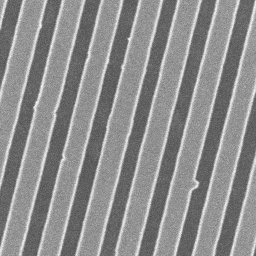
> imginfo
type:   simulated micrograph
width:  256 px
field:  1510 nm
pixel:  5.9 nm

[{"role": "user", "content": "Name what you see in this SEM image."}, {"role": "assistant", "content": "parallel lines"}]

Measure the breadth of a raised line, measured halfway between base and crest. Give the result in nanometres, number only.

126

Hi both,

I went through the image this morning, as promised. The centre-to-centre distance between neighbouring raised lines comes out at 0.221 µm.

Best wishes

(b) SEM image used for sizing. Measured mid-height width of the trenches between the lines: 0.093 um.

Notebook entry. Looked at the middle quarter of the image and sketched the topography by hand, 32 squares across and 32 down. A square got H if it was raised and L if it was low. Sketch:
HLLLLHHHHHHLLLLHHHHHHLLLHHHHHHLL
HLLLLHHHHHLLLLLHHHHHLLLLHHHHHHLL
HLLLLHHHHHLLLLHHHHHHLLLLHHHHHHLL
LLLLHHHHHHLLLLHHHHHHLLLLHHHHHLLL
LLLLHHHHHHLLLLHHHHHLLLLLHHHHHLLL
LLLLHHHHHLLLLLHHHHHLLLLHHHHHHLLL
LLLLHHHHHLLLLHHHHHHLLLLHHHHHHLLL
LLLHHHHHHLLLLHHHHHHLLLLHHHHHLLLL
LLLHHHHHHLLLLHHHHHLLLLLHHHHHLLLL
LLLHHHHHLLLLLHHHHHLLLLHHHHHHLLLL
LLLHHHHHLLLLHHHHHHLLLLHHHHHHLLLL
LLHHHHHHLLLLHHHHHHLLLLHHHHHLLLLL
LLHHHHHLLLLLHHHHHLLLLLHHHHHLLLLH
LLHHHHHLLLLHHHHHHLLLLHHHHHHLLLLH
LLHHHHHLLLLHHHHHHLLLLHHHHHHLLLLH
LLHHHHHLLLLHHHHHHLLLLHHHHHLLLLLH
LHHHHHHLLLLHHHHHHLLLLHHHHHLLLLHH
LHHHHHLLLLLHHHHHLLLLHHHHHHLLLLHH
LHHHHHLLLLHHHHHHLLLLHHHHHHLLLLHH
LHHHHHLLLLHHHHHHLLLLHHHHHLLLLLHH
HHHHHLLLLLHHHHHHLLLLHHHHHLLLLHHH
HHHHHLLLLLHHHHHLLLLHHHHHHLLLLHHH
HHHHHLLLLHHHHHHLLLLHHHHHHLLLLHHH
HHHHHLLLLHHHHHHLLLLHHHHHLLLLHHHH
HHHHHLLLLHHHHHLLLLLHHHHHLLLLHHHH
HHHHLLLLLHHHHHLLLLHHHHHHLLLLHHHH
HHHHLLLLHHHHHHLLLLHHHHHHLLLLHHHH
HHHHLLLLHHHHHHLLLLHHHHHLLLLLHHHH
HHHLLLLLHHHHHHLLLLHHHHHLLLLHHHHH
HHHLLLLLHHHHHLLLLHHHHHHLLLLHHHHH
HHHLLLLHHHHHHLLLLHHHHHHLLLLHHHHH
HHHLLLLHHHHHHLLLLHHHHHLLLLLHHHHH